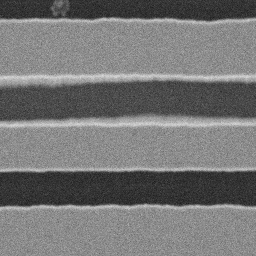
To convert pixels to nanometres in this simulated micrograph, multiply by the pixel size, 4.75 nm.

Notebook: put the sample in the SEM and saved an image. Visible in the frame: lines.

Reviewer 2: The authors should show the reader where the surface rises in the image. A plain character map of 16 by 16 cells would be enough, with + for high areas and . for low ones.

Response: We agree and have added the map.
................
++++++++++++++++
++++++++++++++++
++++++++++++++++
++++++++++++++++
................
................
................
++++++++++++++++
++++++++++++++++
++++++++++++++++
................
................
++++++++++++++++
++++++++++++++++
++++++++++++++++